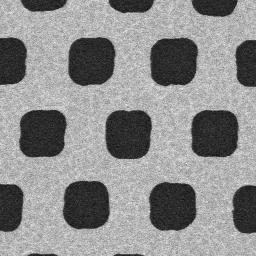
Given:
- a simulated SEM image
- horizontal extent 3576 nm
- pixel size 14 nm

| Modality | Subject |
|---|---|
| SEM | holes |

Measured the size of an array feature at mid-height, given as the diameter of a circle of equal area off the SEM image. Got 0.704 µm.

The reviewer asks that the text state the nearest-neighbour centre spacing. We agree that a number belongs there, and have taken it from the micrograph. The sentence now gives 1.16 micrometres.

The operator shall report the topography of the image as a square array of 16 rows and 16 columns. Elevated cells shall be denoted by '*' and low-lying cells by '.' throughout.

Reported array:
**..***..***...*
****************
.****..***..****
..**...**...***.
..**...**...***.
****************
****************
*...***..***...*
*...***..***...*
*...***..***...*
****************
*****.****..****
.***...**...***.
.***...**...***.
***************.
****************